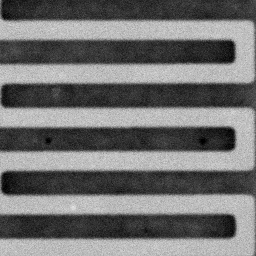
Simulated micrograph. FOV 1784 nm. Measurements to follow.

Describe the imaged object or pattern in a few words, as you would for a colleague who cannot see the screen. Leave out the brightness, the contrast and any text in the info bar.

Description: groups of lines, slits or small figures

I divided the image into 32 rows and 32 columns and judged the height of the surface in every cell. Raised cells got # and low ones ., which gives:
................................
................................
................................
################################
################################
.............................###
..............................##
.............................###
################################
################################
#...............................
................................
................................
#...............................
################################
################################
.............................###
..............................##
.............................###
################################
################################
................................
................................
................................
#..............################.
################################
################################
..............................##
..............................##
.............................###
################################
################################